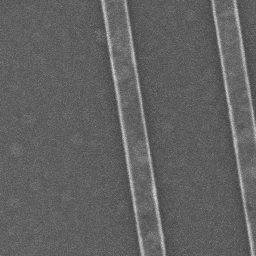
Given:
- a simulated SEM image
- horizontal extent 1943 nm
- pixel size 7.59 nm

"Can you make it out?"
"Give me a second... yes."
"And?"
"one or a few lines or trenches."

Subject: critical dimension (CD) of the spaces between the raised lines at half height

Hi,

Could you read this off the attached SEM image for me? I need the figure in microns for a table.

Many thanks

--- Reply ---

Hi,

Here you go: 0.65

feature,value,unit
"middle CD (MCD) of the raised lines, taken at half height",172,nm